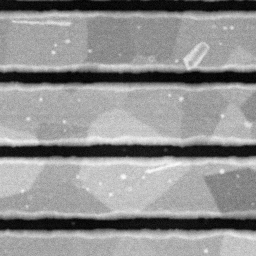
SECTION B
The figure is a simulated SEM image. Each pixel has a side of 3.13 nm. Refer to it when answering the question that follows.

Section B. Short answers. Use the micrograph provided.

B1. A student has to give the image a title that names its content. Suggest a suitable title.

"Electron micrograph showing lines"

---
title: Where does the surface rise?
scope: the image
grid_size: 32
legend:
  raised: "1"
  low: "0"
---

00000000000000000000000000000000
00000000000000000000000000000000
11111111111111111111111111111111
11111111111111111111111111111111
11111111111111111111111111111111
11111111111111111111111111111111
11111111111111111111111111111111
11111111111111111111111111111111
11111111111111111111111111111111
00000000000000000000000000000000
00000000000000000000010000001100
11111111111111111111111111111111
11111111111111111111111111111111
11111111111111111111111111111111
11111111111111111111111111111111
11111111111111111111111111111111
11111111111111111111111111111111
11111111111111111111111111111111
00000000000000000000000000000000
00000000000000000000000000000000
11111111111111111111111111111111
11111111111111111111111111111111
11111111111111111111111111111111
11111111111111111111111111111111
11111111111111111111111111111111
11111111111111111111111111111111
11111111111111111111111111111111
00000000000000000000000000000000
00000000000000000000000000000000
11111111111111111111111111111111
11111111111111111111111111111111
11111111111111111111111111111111